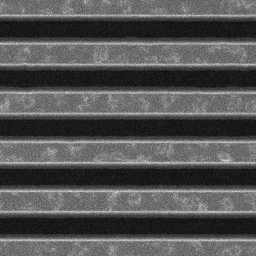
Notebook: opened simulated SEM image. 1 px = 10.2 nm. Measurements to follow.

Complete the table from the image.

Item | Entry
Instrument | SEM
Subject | parallel lines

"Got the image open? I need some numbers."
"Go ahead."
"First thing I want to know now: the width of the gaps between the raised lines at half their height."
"22.7 pixels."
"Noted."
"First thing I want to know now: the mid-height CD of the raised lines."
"0.267 micrometres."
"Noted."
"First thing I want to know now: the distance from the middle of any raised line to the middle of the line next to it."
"500 nanometres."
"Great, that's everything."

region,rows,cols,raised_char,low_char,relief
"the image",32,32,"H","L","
HHHHHHHHHHHHHHHHHHHHHHHHHHHHHHHH
HHHHHHHHHHHHHHHHHHHHHHHHHHHHHHHH
LLLLLLLLLLLLLLLLLLLLLLLLLLLLLLLL
LLLLLLLLLLLLLLLLLLLLLLLLLLLLLLLL
LLLLLLLLLLLLLLLLLLLLLLLLLLLLLLLL
HHHHHHHHHHHHHHHHHHHHHHHHHHHHHHHH
HHHHHHHHHHHHHHHHHHHHHHHHHHHHHHHH
HHHHHHHHHHHHHHHHHHHHHHHHHHHHHHHH
LLLLLLLLLLLLLLLLLLLLLLLLLLLLLLLL
LLLLLLLLLLLLLLLLLLLLLLLLLLLLLLLL
LLLLLLLLLLLLLLLLLLLLLLLLLLLLLLLL
HHHHHHHHHHHHHHHHHHHHHHHHHHHHHHHH
HHHHHHHHHHHHHHHHHHHHHHHHHHHHHHHH
HHHHHHHHHHHHHHHHHHHHHHHHHHHHHHHH
LHHHHHHHHHHHHHHHHHHHHHHHHHHHHHHH
LLLLLLLLLLLLLLLLLLLLLLLLLLLLLLLL
LLLLLLLLLLLLLLLLLLLLLLLLLLLLLLLL
HHHHHHHHHHHHHHHHHHHHHHHHHHHHHHHH
HHHHHHHHHHHHHHHHHHHHHHHHHHHHHHHH
HHHHHHHHHHHHHHHHHHHHHHHHHHHHHHHH
HHHHHHHHHHHHHHHHHHHHHHHHHHHHHHHH
LLLLLLLLLLLLLLLLLLLLLLLLLLLLLLLL
LLLLLLLLLLLLLLLLLLLLLLLLLLLLLLLL
LLLLLLLLLLLLLLLLLLLLLLLLLLLLLLLL
HHHHHHHHHHHHHHHHHHHHHHHHHHHHHHHH
HHHHHHHHHHHHHHHHHHHHHHHHHHHHHHHH
HHHHHHHHHHHHHHHHHHHHHHHHHHHHHHHH
LLLLLLLLLLLLLLLLLLLLLLLLLLLLLLLL
LLLLLLLLLLLLLLLLLLLLLLLLLLLLLLLL
LLLLLLLLLLLLLLLLLLLLLLLLLLLLLLLL
HHHHHHHHHHHHHHHHHHHHHHHHHHHHHHHH
HHHHHHHHHHHHHHHHHHHHHHHHHHHHHHHH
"